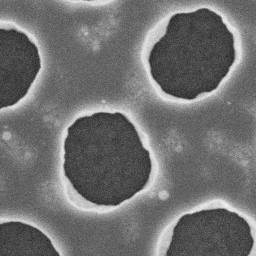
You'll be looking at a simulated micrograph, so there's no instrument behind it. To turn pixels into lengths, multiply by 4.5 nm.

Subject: holes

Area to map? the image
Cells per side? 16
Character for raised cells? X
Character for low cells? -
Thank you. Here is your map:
XXXXXXXXXXXXXXXX
XXXXXXXXXX----XX
--XXXXXXXX-----X
--XXXXXXX------X
--XXXXXXX-----XX
--XXXXXXXX---XXX
-XXXXXXXXXXXXXXX
XXXXX---XXXXXXXX
XXXX-----XXXXXXX
XXXX-----XXXXXXX
XXXX-----XXXXXXX
XXXX-----XXXXXXX
XXXXX---XXXXXXXX
XXXXXXXXXXXX---X
---XXXXXXXX-----
---XXXXXXX------